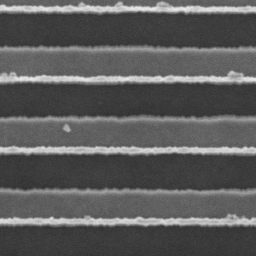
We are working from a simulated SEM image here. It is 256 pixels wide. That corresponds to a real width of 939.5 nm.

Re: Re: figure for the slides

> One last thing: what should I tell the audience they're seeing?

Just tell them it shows lines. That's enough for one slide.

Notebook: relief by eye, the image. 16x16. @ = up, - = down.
@@@@@@@@@@@@@@@@
----------------
----------------
@@@@@@@@@@@@@@@@
@@@@@@@@@@@@@@@@
----------------
----------------
@@@@@@@@@@@@@@@@
@@@@@@@@@@@@@@@@
@@@@@@@@@@@@@@@@
----------------
----------------
@@@@@@@@@@@@@@@@
@@@@@@@@@@@@@@@@
----------------
----------------